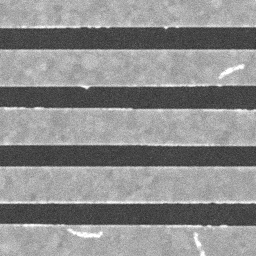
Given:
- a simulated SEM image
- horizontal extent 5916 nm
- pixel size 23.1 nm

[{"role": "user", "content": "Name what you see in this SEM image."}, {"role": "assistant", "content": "lines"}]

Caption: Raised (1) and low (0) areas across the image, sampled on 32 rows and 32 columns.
11111111111111111111111111111111
11111111111111111111111111111111
11111111111111111111111111111111
00000000000000000000000000000000
00000000000000000000000000000000
00000000000000000000000000000000
11111111111111111111111111111111
11111111111111111111111111111111
11111111111111111111111111111111
11111111111111111111111111111111
11111111111111111111111111111111
00000000000000000000000000000000
00000000000000000000000000000000
11101100000000000000000000000000
11111111111111111111111111111111
11111111111111111111111111111111
11111111111111111111111111111111
11111111111111111111111111111111
00000000000000000000000000000000
00000000000000000000000000000000
00000000000000000000000000000000
11111111111111111111111111111111
11111111111111111111111111111111
11111111111111111111111111111111
11111111111111111111111111111111
00000000000000000000000000000000
00000000000000000000000000000000
00000000000000000000000000000000
11111111111111111111111111111111
11111111111111111111111111111111
11111111111111111111111111111111
11111111111111111111111111111111